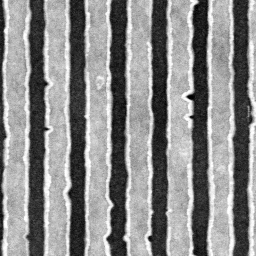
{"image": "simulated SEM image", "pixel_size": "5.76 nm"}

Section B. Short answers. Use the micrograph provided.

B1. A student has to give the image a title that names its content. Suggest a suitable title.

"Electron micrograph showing parallel lines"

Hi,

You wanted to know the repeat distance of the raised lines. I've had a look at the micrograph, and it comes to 235 nanometers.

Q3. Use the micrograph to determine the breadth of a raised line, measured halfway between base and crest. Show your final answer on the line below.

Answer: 141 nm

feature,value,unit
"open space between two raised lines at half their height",97.2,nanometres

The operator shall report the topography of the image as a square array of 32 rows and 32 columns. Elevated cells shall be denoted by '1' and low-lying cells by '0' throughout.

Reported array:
11100011100111001110011100111001
01110011100111001110011100111001
01110011100111001110011100111001
01110011100111001110011100111001
01100011100111001110011100111001
01100011100111001110011100111001
01100011100111001110011100111001
01110011100111001110011100111001
11110011100111001110011100111001
11110011100111001110011100111001
01100011100111001110011100111001
01100011100111001110011100111001
01110011100111001110011100111001
01110011000111001110011100111000
01110011100111001110011100111000
01110011100111001110011100111001
01110011100111001110011100111001
01110011100111001110011100111001
01110011100111001110011100111001
01100011100111001110011100111001
01100011100111001110011100111001
01100011100111001110011100111001
01100011100111001110011100111001
11100011100111001110011100111001
01100011000111001110011100111001
11100011100111001110011100111001
01100011100111001110011100111001
01100011100111001110011100111001
01100011100111001110011100111001
11100011100110001110011100111001
11100011100110001110011100111001
11100011100111001110011100111001